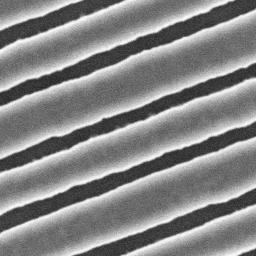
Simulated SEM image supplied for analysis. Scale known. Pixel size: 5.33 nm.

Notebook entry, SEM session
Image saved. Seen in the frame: lines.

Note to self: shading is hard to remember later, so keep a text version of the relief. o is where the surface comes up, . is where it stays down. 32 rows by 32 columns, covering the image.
ooooooooo......ooooooooooooo....
oooooo......ooooooooooooo......o
ooo.......ooooooooooooo......ooo
o......ooooooooooooo......oooooo
....ooooooooooooo.......oooooooo
..ooooooooooooo......ooooooooooo
oooooooooooo......oooooooooooooo
oooooooooo......oooooooooooooooo
oooooooo.....ooooooooooooooooo..
ooooo......oooooooooooooooo.....
oo......ooooooooooooooooo.....oo
.....ooooooooooooooooo.....ooooo
..ooooooooooooooooo.....oooooooo
ooooooooooooooooo.....oooooooooo
oooooooooooooo.....ooooooooooooo
oooooooooooo.....oooooooooooooo.
ooooooooo.....oooooooooooooo....
ooooo......ooooooooooooooo.....o
ooo......ooooooooooooo......oooo
o.....oooooooooooooo.....ooooooo
....ooooooooooooo......ooooooooo
oooooooooooooo......oooooooooooo
oooooooooooo.....ooooooooooooooo
ooooooooo......ooooooooooooooooo
oooooo......oooooooooooooooooo..
ooo.......ooooooooooooooooo.....
o......ooooooooooooooooo......oo
....ooooooooooooooooo......ooooo
..ooooooooooooooooo.....oooooooo
oooooooooooooooo......oooooooooo
ooooooooooooo......ooooooooooooo
oooooooooo.......oooooooooooooo.